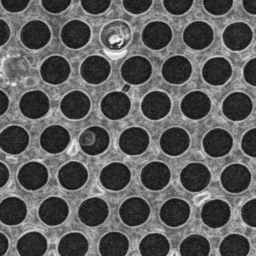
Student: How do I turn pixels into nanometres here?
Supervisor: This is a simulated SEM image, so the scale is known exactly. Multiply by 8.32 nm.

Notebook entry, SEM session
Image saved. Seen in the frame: a regular array of holes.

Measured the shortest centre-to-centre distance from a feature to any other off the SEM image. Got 39.9 pixels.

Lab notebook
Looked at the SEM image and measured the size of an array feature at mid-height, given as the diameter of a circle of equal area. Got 253 nanometres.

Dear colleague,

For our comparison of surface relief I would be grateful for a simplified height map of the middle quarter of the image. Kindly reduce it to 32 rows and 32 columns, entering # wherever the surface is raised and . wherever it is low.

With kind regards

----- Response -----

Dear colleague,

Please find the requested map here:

..##........##........###.......
..##........##........##........
..##........##........##........
.####......####......####......#
######....#####.....######....##
###############..###############
###.##########..################
#.....#####.....#####.....#####.
......####......####.......###..
.......##........##........##...
.......##........##........##...
.......##........##........##...
......####......####......####..
#....#####.....######....######.
################################
#######..########.##############
.####.....#####.....#####.....##
.###.......###.......####......#
..##........##.......###........
..##........##........##........
.###.......###.......###.......#
####.......###.......###.......#
#####....######....######.....##
################################
#...########..########..########
.....#####......####......####..
......###........##........###..
......###........##........##...
......###........##........##...
......###........##.......###...
.....#####......####......###...
#..########...#######...#######.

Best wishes